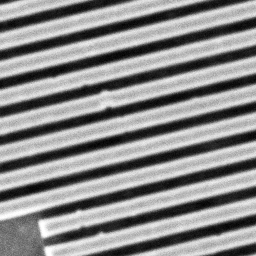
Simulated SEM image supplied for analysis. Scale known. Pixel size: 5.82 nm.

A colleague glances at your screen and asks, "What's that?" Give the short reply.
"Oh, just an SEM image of parallel lines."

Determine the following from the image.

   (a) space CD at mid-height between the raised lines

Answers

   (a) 0.0693 µm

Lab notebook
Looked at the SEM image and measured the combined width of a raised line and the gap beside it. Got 160 nm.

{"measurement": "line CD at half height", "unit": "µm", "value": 0.0913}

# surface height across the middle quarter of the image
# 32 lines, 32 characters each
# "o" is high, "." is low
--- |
.........oooooooooooooooo.......
.....oooooooooooooooo...........
.oooooooooooooooo.............oo
ooooooooooooo.............oooooo
ooooooooo.............oooooooooo
oooo..............oooooooooooooo
o.............oooooooooooooooo..
.........ooooooooooooooooo......
.....ooooooooooooooooo..........
.oooooooooooooooo.............oo
ooooooooooooo............ooooooo
ooooooooo............ooooooooooo
ooooo............ooooooooooooooo
o............ooooooooooooooooo..
.........ooooooooooooooooo......
.....ooooooooooooooooo..........
oooooooooooooooooo............oo
oooooooooooooo............oooooo
oooooooooo............oooooooooo
ooooo............ooooooooooooooo
o............oooooooooooooooooo.
.........ooooooooooooooooo......
.....ooooooooooooooooo..........
.ooooooooooooooooo............oo
oooooooooooooo.............ooooo
oooooooooo............oooooooooo
oooooo............oooooooooooooo
oo............oooooooooooooooo..
.........oooooooooooooooooo.....
.....oooooooooooooooooo.........
.oooooooooooooooo..............o
oooooooooooooo............oooooo